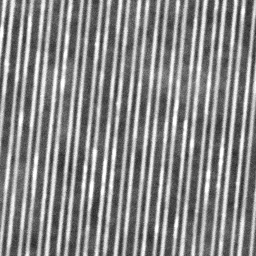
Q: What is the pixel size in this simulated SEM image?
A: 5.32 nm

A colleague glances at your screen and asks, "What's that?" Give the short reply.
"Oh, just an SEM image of parallel lines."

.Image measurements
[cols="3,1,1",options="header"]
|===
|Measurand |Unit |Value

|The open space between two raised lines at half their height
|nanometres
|30.4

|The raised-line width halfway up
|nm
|13.9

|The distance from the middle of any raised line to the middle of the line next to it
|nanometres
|51.1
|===